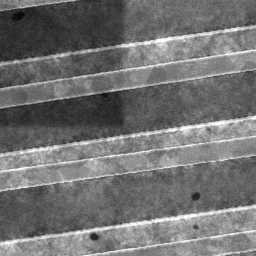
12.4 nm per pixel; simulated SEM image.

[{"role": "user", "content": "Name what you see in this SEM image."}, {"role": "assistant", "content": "lines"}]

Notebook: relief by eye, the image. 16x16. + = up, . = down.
+...............
................
..........++++++
....++++++++++++
+++++++++++++++.
+++++++++.......
++..............
...............+
........++++++++
.+++++++++++++++
++++++++++......
+++.............
................
............++++
.....+++++++++++
++++++++++++++++